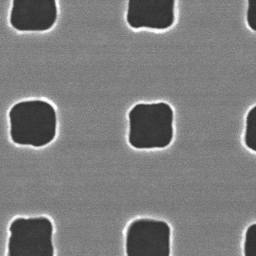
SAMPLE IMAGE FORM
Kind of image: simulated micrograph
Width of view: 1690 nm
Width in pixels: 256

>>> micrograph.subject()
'holes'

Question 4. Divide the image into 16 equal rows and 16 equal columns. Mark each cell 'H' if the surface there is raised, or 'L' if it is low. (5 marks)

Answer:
HLLLHHHHLLLHHHHL
HLLHHHHHLLLHHHHH
HHHHHHHHHHHHHHHH
HHHHHHHHHHHHHHHH
HHHHHHHHHHHHHHHH
HHHHHHHHHHHHHHHH
HLLHHHHHHLHHHHHH
HLLHHHHHLLLHHHHL
HLLHHHHHLLLHHHHL
HHHHHHHHHHHHHHHH
HHHHHHHHHHHHHHHH
HHHHHHHHHHHHHHHH
HHHHHHHHHHHHHHHH
HHHHHHHHHHHHHHHH
HLLHHHHHLLLHHHHL
HLLHHHHHLLLHHHHL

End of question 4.